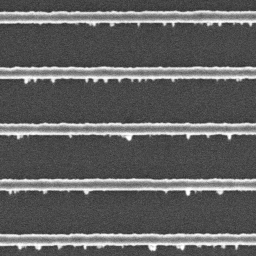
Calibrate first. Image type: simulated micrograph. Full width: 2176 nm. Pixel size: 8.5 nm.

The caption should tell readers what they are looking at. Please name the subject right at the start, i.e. lines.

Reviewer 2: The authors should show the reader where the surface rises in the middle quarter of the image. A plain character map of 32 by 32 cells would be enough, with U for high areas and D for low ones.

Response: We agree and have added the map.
DDDDDDDDDDDDDDDDDDDDDDDDDDDDDDDD
UUUUUUUUUUUUUUUUUUUUUUUUUUUUUUUU
UUUUUUUUUUUUUUUUUUUUUUUUUUUUUUUU
UUUUUUDUUUUUDUUDUUUUUUUDUUUUUUUU
DDDDDDDDDDDDDDDDDDDDDDDDDDDDDDDD
DDDDDDDDDDDDDDDDDDDDDDDDDDDDDDDD
DDDDDDDDDDDDDDDDDDDDDDDDDDDDDDDD
DDDDDDDDDDDDDDDDDDDDDDDDDDDDDDDD
DDDDDDDDDDDDDDDDDDDDDDDDDDDDDDDD
DDDDDDDDDDDDDDDDDDDDDDDDDDDDDDDD
DDDDDDDDDDDDDDDDDDDDDDDDDDDDDDDD
DDDDDDDDDDDDDDDDDDDDDDDDDDDDDDDD
DDDDDDDDDDDDDDDDDDDDDDDDDDDDDDDD
DDDDDDDDDDDDDDDDDDDDDDDDDDDDDDDD
DDDDDDDDDDDDDDDDDDDDDDDDDDDDDDDD
UUUUUUUUUUUUUUUUUUUUUUUUUUUUUUUU
UUUUUUUUUUUUUUUUUUUUUUUUUUUUUUUU
UUUUDUUDUUUUUDUUUUUUDDDUDUUUDUDU
DDDDDDDDDDDDDDDDDDDDDDDDDDDDDDDD
DDDDDDDDDDDDDDDDDDDDDDDDDDDDDDDD
DDDDDDDDDDDDDDDDDDDDDDDDDDDDDDDD
DDDDDDDDDDDDDDDDDDDDDDDDDDDDDDDD
DDDDDDDDDDDDDDDDDDDDDDDDDDDDDDDD
DDDDDDDDDDDDDDDDDDDDDDDDDDDDDDDD
DDDDDDDDDDDDDDDDDDDDDDDDDDDDDDDD
DDDDDDDDDDDDDDDDDDDDDDDDDDDDDDDD
DDDDDDDDDDDDDDDDDDDDDDDDDDDDDDDD
DDDDDDDDDDDDDDDDDDDDDDDDDDDDDDDD
DDDDDDDDDDDDDDDDDDDDDDDDDDDDDDDD
UUUUUUUUUUUUUUUUUUUUUUUUUUUUUUUU
UUUUUUUUUUUUUUUUUUUUUUUUUUUUUUUU
DDDDDDDDDDUDDDDDDDDDDDDDDDDDDDDD